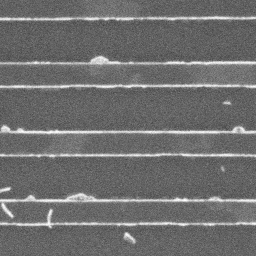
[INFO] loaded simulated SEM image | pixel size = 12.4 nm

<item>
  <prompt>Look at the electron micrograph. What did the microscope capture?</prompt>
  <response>lines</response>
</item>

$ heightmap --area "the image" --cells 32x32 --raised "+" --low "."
++++++++++++++++++++++++++++++++
++++++++++++++++++++++++++++++++
................................
................................
................................
................................
................................
............+...................
++++++++++++++++++++++++++++++++
++++++++++++++++++++++++++++++++
++++++++++++++++++++++++++++++++
................................
................................
................................
................................
................................
++++++++++++++++++++++++++++++++
++++++++++++++++++++++++++++++++
++++++++++++++++++++++++++++++++
....+..........................+
................................
................................
................................
................................
.........++.....................
++++++++++++++++++++++++++++++++
++++++++++++++++++++++++++++++++
++++++++++++++++++++++++++++++++
................................
................................
................................
................................